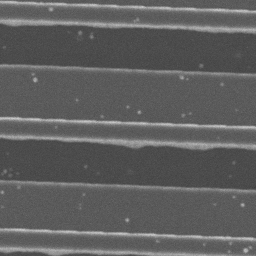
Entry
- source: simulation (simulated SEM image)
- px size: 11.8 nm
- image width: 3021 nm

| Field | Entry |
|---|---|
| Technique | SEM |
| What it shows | lines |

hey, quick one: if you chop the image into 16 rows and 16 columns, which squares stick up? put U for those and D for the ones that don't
UUUUUUUUUUUUUUUU
DDDDDUUUUUUUUUUU
DDDDDDDDDDDDDDDD
DDDDDDDDDDDDDDDD
UUUUUUUUUUUDDDDD
UUUUUUUUUUUUUUUU
UUUUUUUUUUUUUUUU
UUUUUUUUUUUUUUUU
UUUUUUUUUUUUUUUU
DDDDDDDDDDDDDDDD
DDDDDDDDDDDDDDDD
UUUUUDDDDDDDDDDD
UUUUUUUUUUUUUUUU
UUUUUUUUUUUUUUUU
UUUUUUUUUUUUUUUU
UUUUUUUUUUUUUUUU